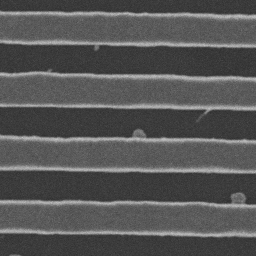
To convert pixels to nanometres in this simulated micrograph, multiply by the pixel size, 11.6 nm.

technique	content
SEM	lines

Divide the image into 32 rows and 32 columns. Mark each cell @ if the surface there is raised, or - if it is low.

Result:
--------------------------------
--------------------------------
@@@@@@@@@@@@@@@@@@@@@@@@@@@@@@@@
@@@@@@@@@@@@@@@@@@@@@@@@@@@@@@@@
@@@@@@@@@@@@@@@@@@@@@@@@@@@@@@@@
---@@@@@@@@@@@@@@@@@@@@@@@@@@@@@
--------------------------------
--------------------------------
--------------------------------
@@@@@@@@@@@@@@@@@@@@@@@@--------
@@@@@@@@@@@@@@@@@@@@@@@@@@@@@@@@
@@@@@@@@@@@@@@@@@@@@@@@@@@@@@@@@
@@@@@@@@@@@@@@@@@@@@@@@@@@@@@@@@
--------------@@@@@@@@@@@@@@@@@@
--------------------------------
--------------------------------
--------------------------------
@@@@@@@@@@@@@@@@@@@@@@@@@@@@@-@-
@@@@@@@@@@@@@@@@@@@@@@@@@@@@@@@@
@@@@@@@@@@@@@@@@@@@@@@@@@@@@@@@@
@@@@@@@@@@@@@@@@@@@@@@@@@@@@@@@@
----------------------------@@@@
--------------------------------
--------------------------------
--------------------------------
@@@@@@@@@@@@@@@@@@@@@@@@@@@-----
@@@@@@@@@@@@@@@@@@@@@@@@@@@@@@@@
@@@@@@@@@@@@@@@@@@@@@@@@@@@@@@@@
@@@@@@@@@@@@@@@@@@@@@@@@@@@@@@@@
--------------------------@@--@@
--------------------------------
--------------------------------